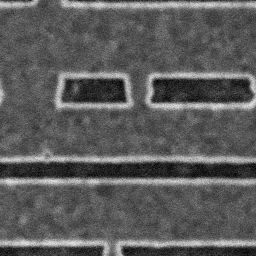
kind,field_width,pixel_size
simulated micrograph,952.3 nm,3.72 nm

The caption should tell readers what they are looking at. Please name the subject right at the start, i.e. one or a few lines or trenches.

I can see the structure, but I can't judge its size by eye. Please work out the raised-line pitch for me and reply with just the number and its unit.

86.1 px